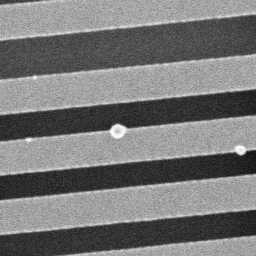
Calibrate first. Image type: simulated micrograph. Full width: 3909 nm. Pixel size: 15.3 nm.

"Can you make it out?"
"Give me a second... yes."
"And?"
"lines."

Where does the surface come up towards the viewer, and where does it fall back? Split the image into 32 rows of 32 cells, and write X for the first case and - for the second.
---XXXXXXXXXXXXXXXXXXXXXXXXXXXXX
XXXXXXXXXXXXXXXXXXXXXXXXXXXXXXXX
XXXXXXXXXXXXXXXXXXXXXXXXX-------
XXXXXXXXXXXXXXX-----------------
XXXXX---------------------------
--------------------------------
--------------------------------
--------------------------XXXXXX
---------------XXXXXXXXXXXXXXXXX
-----XXXXXXXXXXXXXXXXXXXXXXXXXXX
XXXXXXXXXXXXXXXXXXXXXXXXXXXXXXXX
XXXXXXXXXXXXXXXXXXXXXXXXXXX-----
XXXXXXXXXXXXXXXXXXX-------------
XXXXXXXX------------------------
--------------------------------
----------------------XXXXXXXXXX
-------------XXXXXXXXXXXXXXXXXXX
---XXXXXXXXXXXXXXXXXXXXXXXXXXXXX
XXXXXXXXXXXXXXXXXXXXXXXXXXXXXXXX
XXXXXXXXXXXXXXXXXXXXXXXX--------
XXXXXXXXXXXXXX------------------
XXX-----------------------------
--------------------------XXXXXX
----------------XXXXXXXXXXXXXXXX
------XXXXXXXXXXXXXXXXXXXXXXXXXX
XXXXXXXXXXXXXXXXXXXXXXXXXXXXXXXX
XXXXXXXXXXXXXXXXXXXXXXXXXXXX----
XXXXXXXXXXXXXXXXXX--------------
XXXXXXXXX-----------------------
--------------------------------
----------------------XXXXXXXXXX
------------XXXXXXXXXXXXXXXXXXXX